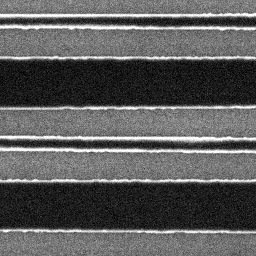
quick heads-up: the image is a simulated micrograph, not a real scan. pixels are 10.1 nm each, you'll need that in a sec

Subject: lines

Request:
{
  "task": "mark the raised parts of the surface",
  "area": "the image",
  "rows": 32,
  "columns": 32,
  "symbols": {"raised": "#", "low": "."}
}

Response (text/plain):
................................
................................
################################
...#.....#.#####################
................................
................................
................................
################################
################################
################################
################################
################################
################################
######################..........
................................
................................
................................
################################
################################
................................
................................
................................
................................
################################
################################
################################
################################
################################
################################
................................
................................
................................